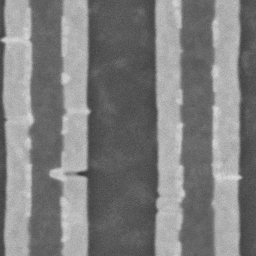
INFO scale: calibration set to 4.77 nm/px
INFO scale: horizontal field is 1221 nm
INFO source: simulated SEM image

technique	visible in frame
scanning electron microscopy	one or a few lines or trenches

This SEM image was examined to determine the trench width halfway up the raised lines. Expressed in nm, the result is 445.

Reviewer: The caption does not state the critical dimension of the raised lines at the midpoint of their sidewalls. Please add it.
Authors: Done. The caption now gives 0.278 µm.